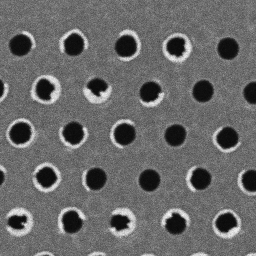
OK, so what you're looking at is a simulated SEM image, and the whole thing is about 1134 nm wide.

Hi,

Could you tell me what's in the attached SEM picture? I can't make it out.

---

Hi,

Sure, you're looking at a regular array of holes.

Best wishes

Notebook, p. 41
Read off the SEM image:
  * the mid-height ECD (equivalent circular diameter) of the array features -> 20.4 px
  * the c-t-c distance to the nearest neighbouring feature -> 219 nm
